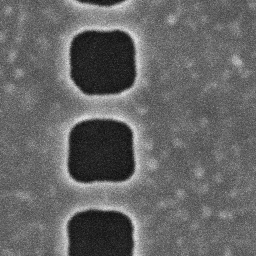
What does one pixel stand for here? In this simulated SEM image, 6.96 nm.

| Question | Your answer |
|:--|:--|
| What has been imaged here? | holes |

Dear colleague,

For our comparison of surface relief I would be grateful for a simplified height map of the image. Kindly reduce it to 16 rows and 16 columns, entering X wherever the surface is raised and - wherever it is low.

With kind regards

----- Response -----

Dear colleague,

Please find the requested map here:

XXXXXXXXXXXXXXXX
XXXXXXXXXXXXXXXX
XXXXX---XXXXXXXX
XXXX-----XXXXXXX
XXXX-----XXXXXXX
XXXXX---XXXXXXXX
XXXXXXXXXXXXXXXX
XXXXX--XXXXXXXXX
XXXX----XXXXXXXX
XXXX----XXXXXXXX
XXXX----XXXXXXXX
XXXXXXXXXXXXXXXX
XXXXXXXXXXXXXXXX
XXXXX---XXXXXXXX
XXXX----XXXXXXXX
XXXX----XXXXXXXX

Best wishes